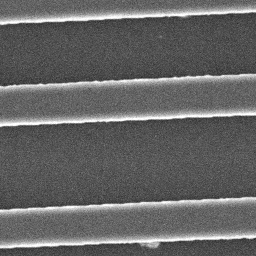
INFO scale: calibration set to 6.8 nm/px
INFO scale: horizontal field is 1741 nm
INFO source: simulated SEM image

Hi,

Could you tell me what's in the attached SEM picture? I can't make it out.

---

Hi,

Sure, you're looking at lines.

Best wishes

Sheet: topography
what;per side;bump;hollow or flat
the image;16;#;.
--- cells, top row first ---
################
#...............
................
................
................
################
################
########........
................
................
................
................
............####
################
################
................